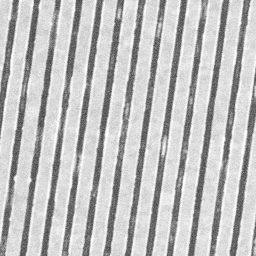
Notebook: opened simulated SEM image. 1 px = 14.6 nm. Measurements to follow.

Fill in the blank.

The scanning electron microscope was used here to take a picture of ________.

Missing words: parallel lines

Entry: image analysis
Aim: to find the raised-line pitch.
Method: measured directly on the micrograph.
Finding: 0.305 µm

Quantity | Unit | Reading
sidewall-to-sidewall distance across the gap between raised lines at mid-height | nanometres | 112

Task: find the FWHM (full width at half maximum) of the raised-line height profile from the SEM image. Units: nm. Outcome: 196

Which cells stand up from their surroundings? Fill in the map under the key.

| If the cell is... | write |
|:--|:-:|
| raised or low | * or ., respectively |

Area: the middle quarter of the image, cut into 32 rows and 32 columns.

...***..***..***..****.****..***
..***...***..***..***..***...***
..***..****..***..***..***...***
..***..***...***..***..***..***.
..***..***...***..***..***..***.
..***..***..****..***..***..***.
..***..***..***..****..***..***.
..***..***..***..****..***..***.
..**...***..***..***..****..***.
.***...***..***..***..***...***.
.***..****..***..***..***...**..
.***..***..****..***..***..***..
.***..***..****..***..***..***..
.***..***..***..****..***..***..
.***..***..***..****..***..***..
.***..***..***..***...**...***..
***...***..***..***..***...***..
***..****..***..***..***...***..
***..***..****..***..***..***...
***..***..****..***..***..***...
***..***..***...***..***..***..*
***..***..***..****..***..***..*
***..***..***..***...***..***..*
**...***..***..***..****..***..*
**...***..***..***..***...***..*
**..***...***..***..***..***...*
**..***...***..***..***..***..**
**..***..***...***..***..***..**
**..***..***..****..***..***..**
**..***..***..***...***..***..**
**..***..***..***..****..***..**
*..****..***..***..***...***..**